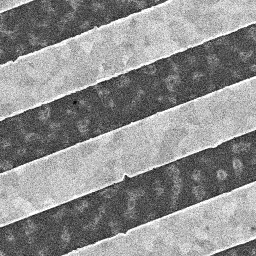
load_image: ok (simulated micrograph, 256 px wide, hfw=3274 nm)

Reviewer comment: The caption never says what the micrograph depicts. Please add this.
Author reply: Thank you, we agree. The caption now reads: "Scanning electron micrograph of one or a few lines or trenches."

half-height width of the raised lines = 49.6 px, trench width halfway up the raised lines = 646 nm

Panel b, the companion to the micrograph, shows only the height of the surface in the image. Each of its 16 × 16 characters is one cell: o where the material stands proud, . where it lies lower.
o.........oooooo
.......ooooooooo
....ooooooooo...
..oooooooo......
oooooooo........
ooooo.........oo
ooo.........oooo
.........ooooooo
......ooooooooo.
....oooooooo....
.ooooooooo......
ooooooo.........
oooo.........ooo
oo........oooooo
........oooooooo
.....ooooooooo..